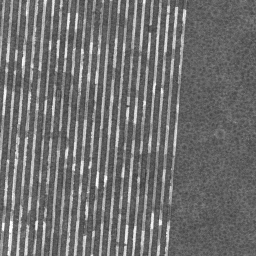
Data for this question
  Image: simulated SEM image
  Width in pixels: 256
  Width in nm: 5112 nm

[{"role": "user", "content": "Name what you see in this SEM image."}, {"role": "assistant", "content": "parallel lines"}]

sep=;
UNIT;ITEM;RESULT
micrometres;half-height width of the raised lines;0.0424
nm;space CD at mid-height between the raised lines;119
